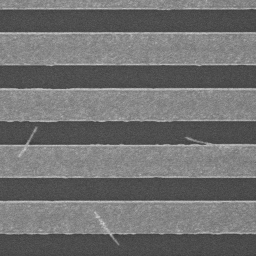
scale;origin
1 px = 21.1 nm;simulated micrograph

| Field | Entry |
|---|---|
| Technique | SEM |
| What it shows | lines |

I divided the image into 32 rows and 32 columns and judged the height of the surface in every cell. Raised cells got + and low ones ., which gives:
++++++++++++++++++++++++++++++++
................................
................................
................................
++++++++++++++++++++++++++++++++
++++++++++++++++++++++++++++++++
++++++++++++++++++++++++++++++++
++++++++++++++++++++++++++++++++
................................
................................
................................
++++++++++++++++++++++++++++++++
++++++++++++++++++++++++++++++++
++++++++++++++++++++++++++++++++
++++++++++++++++++++++++++++++++
................................
................................
................................
++++++++++++++++++++++++++++++++
++++++++++++++++++++++++++++++++
++++++++++++++++++++++++++++++++
++++++++++++++++++++++++++++++++
................................
................................
................................
++++++++++++++++++++++++++++++++
++++++++++++++++++++++++++++++++
++++++++++++++++++++++++++++++++
++++++++++++++++++++++++++++++++
................................
................................
................................